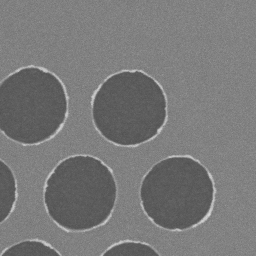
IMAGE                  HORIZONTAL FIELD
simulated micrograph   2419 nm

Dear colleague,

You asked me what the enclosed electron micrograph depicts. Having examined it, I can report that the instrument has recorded holes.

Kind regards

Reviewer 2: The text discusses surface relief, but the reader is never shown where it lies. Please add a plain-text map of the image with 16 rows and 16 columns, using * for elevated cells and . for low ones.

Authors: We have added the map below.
****************
****************
****************
****************
*..*************
....**....******
....**....******
....**....******
*..****...******
****************
.***...***...***
.**....**....***
.**....**....***
***....**....***
****************
*..****..*******